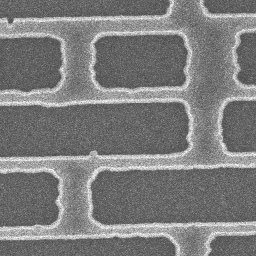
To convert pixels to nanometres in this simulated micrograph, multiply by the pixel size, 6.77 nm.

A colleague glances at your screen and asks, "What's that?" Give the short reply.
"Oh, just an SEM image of one or a few lines or trenches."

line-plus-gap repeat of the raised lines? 462 nm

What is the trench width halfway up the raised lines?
0.372 micrometres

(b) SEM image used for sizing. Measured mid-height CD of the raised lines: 83.7 nm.